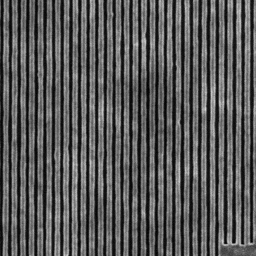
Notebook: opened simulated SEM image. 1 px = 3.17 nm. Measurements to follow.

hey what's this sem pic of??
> parallel lines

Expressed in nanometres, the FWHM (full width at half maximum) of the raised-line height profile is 13.9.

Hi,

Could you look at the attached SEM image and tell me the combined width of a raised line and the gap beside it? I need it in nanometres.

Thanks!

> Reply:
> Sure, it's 27.3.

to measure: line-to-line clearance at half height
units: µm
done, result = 0.0143